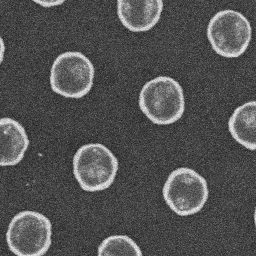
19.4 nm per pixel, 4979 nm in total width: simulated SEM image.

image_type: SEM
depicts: raised bodies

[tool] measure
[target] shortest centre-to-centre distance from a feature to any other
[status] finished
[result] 1.83 microns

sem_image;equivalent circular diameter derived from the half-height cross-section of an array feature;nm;839